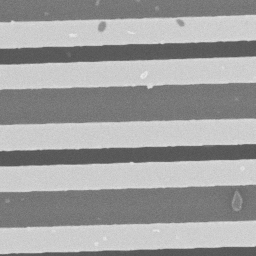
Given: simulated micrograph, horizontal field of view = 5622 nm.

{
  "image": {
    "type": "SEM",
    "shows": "lines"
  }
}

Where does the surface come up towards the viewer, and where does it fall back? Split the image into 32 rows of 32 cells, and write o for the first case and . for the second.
................................
................................
...............ooooooooooooooooo
oooooooooooooooooooooooooooooooo
oooooooooooooooooooooooooooooooo
oooooooooooooooo................
................................
...................ooooooooooooo
oooooooooooooooooooooooooooooooo
oooooooooooooooooooooooooooooooo
ooooooooooooooooooooooooo.......
................................
................................
................................
................................
......oooooooooooooooooooooooooo
oooooooooooooooooooooooooooooooo
oooooooooooooooooooooooooooooooo
oooooooooooooo..................
................................
..............oooooooooooooooooo
oooooooooooooooooooooooooooooooo
oooooooooooooooooooooooooooooooo
oooooooooooooooo................
................................
................................
................................
................................
...ooooooooooooooooooooooooooooo
oooooooooooooooooooooooooooooooo
oooooooooooooooooooooooooooooooo
oooooo..........................